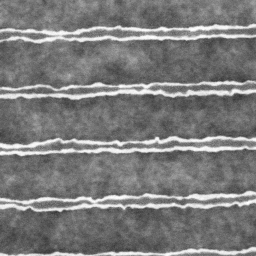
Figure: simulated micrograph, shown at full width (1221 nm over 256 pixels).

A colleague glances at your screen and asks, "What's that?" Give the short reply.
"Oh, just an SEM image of parallel lines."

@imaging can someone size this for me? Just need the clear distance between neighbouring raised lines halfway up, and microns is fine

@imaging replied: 0.221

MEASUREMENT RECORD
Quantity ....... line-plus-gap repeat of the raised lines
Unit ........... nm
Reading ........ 268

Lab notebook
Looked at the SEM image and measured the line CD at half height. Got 45.9 nm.